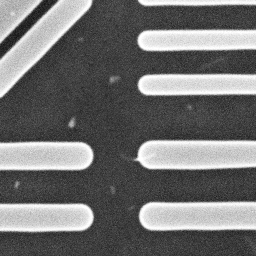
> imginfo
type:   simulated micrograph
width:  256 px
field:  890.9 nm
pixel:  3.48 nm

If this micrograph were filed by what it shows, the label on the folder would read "groups of lines, slits or small figures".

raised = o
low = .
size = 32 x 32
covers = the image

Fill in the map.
ooooo..oooo.......ooooooooooo...
oooo..ooooo.....................
ooo..ooooo......................
oo..ooooo.......................
o..ooooo.........ooooooooooooooo
..ooooo..........ooooooooooooooo
.ooooo..........................
ooooo...........................
oooo............................
ooo...............oooooooooooooo
oo...............ooooooooooooooo
o.................oooooooooooooo
................................
................................
................................
................................
................................
................................
ooooooooooo.......oooooooooooooo
oooooooooooo.....ooooooooooooooo
ooooooooooo.......oooooooooooooo
................................
................................
................................
................................
...................ooooooooooooo
ooooooooooo.......oooooooooooooo
oooooooooooo......oooooooooooooo
ooooooooooo.......oooooooooooooo
................................
................................
................................